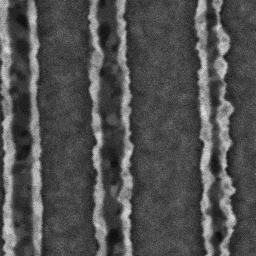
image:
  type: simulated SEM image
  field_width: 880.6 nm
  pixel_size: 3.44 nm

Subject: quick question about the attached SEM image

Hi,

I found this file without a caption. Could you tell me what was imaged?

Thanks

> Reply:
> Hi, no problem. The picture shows one or a few lines or trenches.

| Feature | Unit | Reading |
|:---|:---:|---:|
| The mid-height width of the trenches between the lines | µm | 0.242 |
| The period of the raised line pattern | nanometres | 333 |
